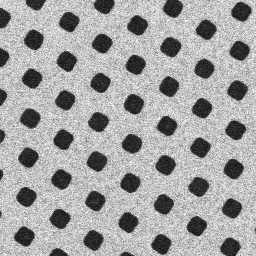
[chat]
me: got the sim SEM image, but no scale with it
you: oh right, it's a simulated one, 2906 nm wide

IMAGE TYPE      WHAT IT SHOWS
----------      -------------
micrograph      a regular array of holes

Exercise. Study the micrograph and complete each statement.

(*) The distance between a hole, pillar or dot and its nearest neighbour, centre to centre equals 446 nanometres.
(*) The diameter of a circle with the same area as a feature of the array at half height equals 18.9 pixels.